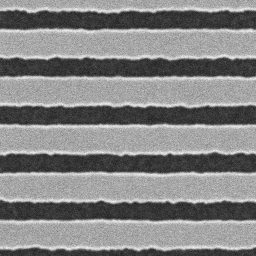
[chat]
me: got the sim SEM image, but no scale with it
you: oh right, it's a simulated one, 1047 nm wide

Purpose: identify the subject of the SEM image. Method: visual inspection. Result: lines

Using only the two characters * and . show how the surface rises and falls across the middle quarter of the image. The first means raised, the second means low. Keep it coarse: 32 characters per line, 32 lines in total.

................................
................................
................................
********************************
********************************
********************************
********************************
********************************
********************************
********************************
***.........***..*.**..*****..**
................................
................................
................................
................................
*********************.**********
********************************
********************************
********************************
********************************
********************************
********************************
******.....***************.***..
................................
................................
................................
................................
********************************
********************************
********************************
********************************
********************************